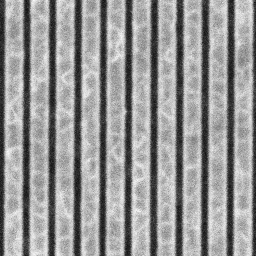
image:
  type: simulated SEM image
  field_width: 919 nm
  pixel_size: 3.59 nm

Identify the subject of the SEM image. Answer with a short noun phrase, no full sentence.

parallel lines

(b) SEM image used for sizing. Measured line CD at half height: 57.9 nm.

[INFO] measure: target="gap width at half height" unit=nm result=33.7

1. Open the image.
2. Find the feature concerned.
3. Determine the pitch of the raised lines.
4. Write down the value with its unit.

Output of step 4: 91.5 nanometres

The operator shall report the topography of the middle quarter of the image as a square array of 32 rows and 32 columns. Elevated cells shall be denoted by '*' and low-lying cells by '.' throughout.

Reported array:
**...****..****...***...****..**
**...****..****...***...****..**
**...****..****...***...****..**
**...****..****...***...****..**
**...****..****...***...****..**
**...****..****...***...****..**
**...****..****...***...****..**
**...****..****...***...****..**
**...****..****...***...****..**
**...****..****...***...****..**
**...****..****...***...****..**
**...****..****...***...****..**
**...****..****...***...****..**
**...****..****...***...***...**
**...****..****...***...****..**
**...****..****...***...****..**
**...****..****...***...****..**
**...****..****..****...****..**
**...****..****..****...****..**
**...****..****..****...***...**
**...****..****..****...****..**
**...****..****..****...***...**
**...****..****..****...***...**
**...****..****..****...***...**
**...****..****..****...***...**
**...***...****..****...***...**
**...***...****..****...****..**
**...***...****..****...****..**
**...***...****..****...****..**
**...***...****..****...***...**
**...***...****..****...****..**
**...***...****..****...****..**